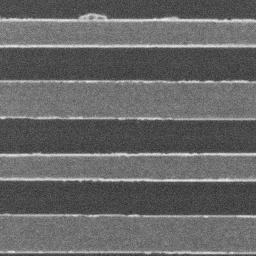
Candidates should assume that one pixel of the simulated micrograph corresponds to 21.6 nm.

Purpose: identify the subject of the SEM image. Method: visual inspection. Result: lines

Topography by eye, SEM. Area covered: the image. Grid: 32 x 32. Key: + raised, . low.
................................
................................
+++++++++++++++++++++++++++.....
++++++++++++++++++++++++++++++++
++++++++++++++++++++++++++++++++
++++++++++++++++++++++++++++++++
................................
................................
................................
................................
++++++++++++++++++++++++++++++++
++++++++++++++++++++++++++++++++
++++++++++++++++++++++++++++++++
++++++++++++++++++++++++++++++++
++++++++++++++++++++++++++++++++
................................
................................
................................
................................
++++++++++++++++++++++++++++++++
++++++++++++++++++++++++++++++++
++++++++++++++++++++++++++++++++
.............+.++.++++++++++++++
................................
................................
................................
................................
++++++++++++++++++++++++++++++++
++++++++++++++++++++++++++++++++
++++++++++++++++++++++++++++++++
++++++++++++++++++++++++++++++++
++++++++++++++++++++++++++++++++